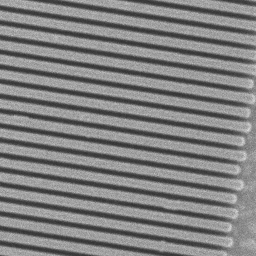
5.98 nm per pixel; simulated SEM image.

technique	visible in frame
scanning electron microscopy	parallel lines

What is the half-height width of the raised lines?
56.1 nm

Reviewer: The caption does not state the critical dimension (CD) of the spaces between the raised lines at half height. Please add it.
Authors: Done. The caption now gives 5.05 px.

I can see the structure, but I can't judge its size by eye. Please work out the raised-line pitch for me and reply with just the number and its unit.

86.7 nm